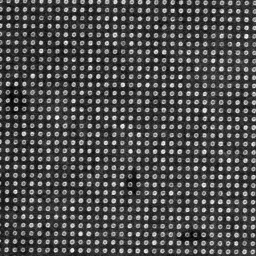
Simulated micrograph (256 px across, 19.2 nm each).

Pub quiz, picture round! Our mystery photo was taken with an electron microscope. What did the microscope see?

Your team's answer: a regular array of raised bodies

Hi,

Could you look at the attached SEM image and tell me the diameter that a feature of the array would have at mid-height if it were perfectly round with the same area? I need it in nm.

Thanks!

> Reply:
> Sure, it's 68.6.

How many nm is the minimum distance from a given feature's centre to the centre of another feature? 154